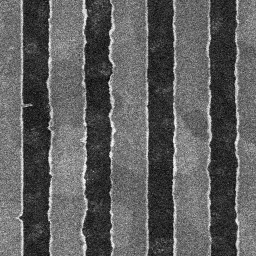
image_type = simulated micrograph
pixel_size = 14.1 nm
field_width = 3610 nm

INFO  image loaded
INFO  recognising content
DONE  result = one or a few lines or trenches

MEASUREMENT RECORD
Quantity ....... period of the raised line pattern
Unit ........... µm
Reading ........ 0.877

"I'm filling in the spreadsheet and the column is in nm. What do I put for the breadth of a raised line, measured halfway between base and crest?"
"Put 506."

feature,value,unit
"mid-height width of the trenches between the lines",382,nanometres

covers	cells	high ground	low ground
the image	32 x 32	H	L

HHHLLLHHHHLLLLHHHHLLLLHHHHLLLLHH
HHHLLLHHHHHLLLHHHHLLLLHHHHLLLLHH
HHHLLLHHHHHLLLHHHHLLLLHHHHLLLLHH
HHHLLLHHHHHLLLHHHHLLLLHHHHLLLLHH
HHHLLLHHHHHLLLHHHHLLLLHHHHLLLLHH
HHHLLLHHHHHLLLHHHHLLLLHHHHLLLLHH
HHHLLLHHHHLLLLHHHHLLLLHHHHLLLLHH
HHHLLLHHHHLLLLHHHHLLLLHHHHLLLLHH
HHHLLLHHHHLLLLHHHHLLLLHHHHLLLLHH
HHHLLLHHHHLLLLHHHHLLLLHHHHLLLLHH
HHHLLLHHHHHLLLHHHHLLLLHHHHLLLLHH
HHHLLLHHHHHLLLHHHHLLLLHHHHLLLLHH
HHHLLLHHHHHLLLHHHHLLLLHHHHLLLLHH
HHHLLLHHHHHLLLHHHHLLLLHHHHLLLLHH
HHHLLLHHHHHLLLHHHHLLLLHHHHLLLLHH
HHHLLLHHHHHLLLHHHHLLLLHHHHLLLLHH
HHHLLLHHHHHLLLHHHHLLLLHHHHLLLLHH
HHHLLLHHHHHLLLHHHHLLLLHHHHLLLLHH
HHHLLLHHHHHLLLHHHHLLLLHHHHLLLLHH
HHHLLLHHHHHLLLHHHHLLLLHHHHLLLLHH
HHHLLLHHHHHLLLHHHHLLLLHHHHLLLLHH
HHHLLLHHHHHLLLHHHHLLLLHHHHLLLLHH
HHHLLLHHHHLLLLHHHHLLLLHHHHLLLLHH
HHHLLLHHHHHLLLHHHHLLLLHHHHLLLLHH
HHHLLLHHHHHLLLHHHHLLLLHHHHLLLLHH
HHHLLLHHHHHLLLHHHHLLLLHHHHLLLLHH
HHHLLLHHHHHLLLHHHHLLLLHHHHLLLLHH
HHHLLLHHHHLLLLHHHHLLLLHHHHLLLLHH
HHHLLLHHHHLLLLHHHHLLLLHHHHLLLLHH
HHHLLLHHHHLLLLHHHHLLLLHHHHLLLLHH
HHHLLLHHHHHLLLHHHHLLLLHHHHLLLLHH
HHHLLLHHHHHLLLHHHHLLLLHHHHLLLLHH